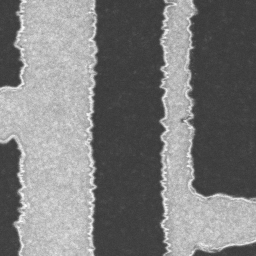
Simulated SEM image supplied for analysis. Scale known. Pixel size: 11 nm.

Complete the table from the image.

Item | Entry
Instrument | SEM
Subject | one or a few lines or trenches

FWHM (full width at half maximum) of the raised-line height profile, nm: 804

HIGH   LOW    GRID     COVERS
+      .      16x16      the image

+.....+++++.++++
+.....++++..++++
+.....++++..++++
+.....++++..++++
+.....++++..++++
+.....++++..++++
......++++..++++
......++++..++++
......++++..++++
+.....++++..++++
+.....++++..++++
+.....++++..++++
+.....++++.....+
+.....++++......
+.....++++......
+.....++++..+.++